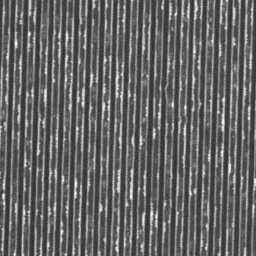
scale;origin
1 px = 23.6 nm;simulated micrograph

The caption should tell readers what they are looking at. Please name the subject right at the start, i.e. parallel lines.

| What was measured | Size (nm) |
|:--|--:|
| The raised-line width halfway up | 174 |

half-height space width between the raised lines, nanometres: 133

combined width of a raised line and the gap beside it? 301 nanometers